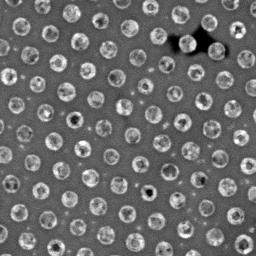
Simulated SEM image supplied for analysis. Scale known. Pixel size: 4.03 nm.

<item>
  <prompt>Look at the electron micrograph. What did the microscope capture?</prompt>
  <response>a regular array of raised bodies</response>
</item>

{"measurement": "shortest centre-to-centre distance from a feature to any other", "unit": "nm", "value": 118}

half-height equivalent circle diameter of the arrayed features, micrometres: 0.0648